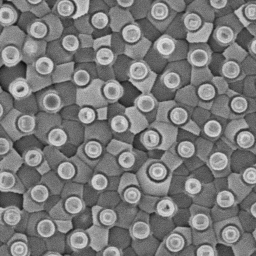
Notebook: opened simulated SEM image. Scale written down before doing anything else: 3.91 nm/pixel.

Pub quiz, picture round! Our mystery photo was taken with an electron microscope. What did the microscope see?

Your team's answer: a regular array of raised bodies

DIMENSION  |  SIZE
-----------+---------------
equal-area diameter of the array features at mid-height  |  15.9 px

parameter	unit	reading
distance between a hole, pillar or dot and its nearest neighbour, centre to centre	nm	128